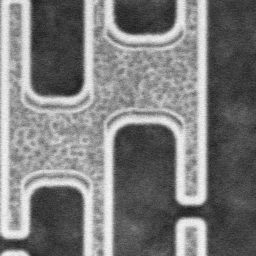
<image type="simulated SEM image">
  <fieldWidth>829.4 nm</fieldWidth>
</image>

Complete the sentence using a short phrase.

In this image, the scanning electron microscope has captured one or a few lines or trenches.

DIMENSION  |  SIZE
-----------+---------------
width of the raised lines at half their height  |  22.4 px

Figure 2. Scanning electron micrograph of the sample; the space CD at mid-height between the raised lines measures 200 nm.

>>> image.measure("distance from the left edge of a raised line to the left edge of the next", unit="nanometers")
283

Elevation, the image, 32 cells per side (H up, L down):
LHHLLLLLLLLHHHLLLLLLLLLHHLLLLLLL
LHHLLLLLLLLHHHLLLLLLLLLHHLLLLLLL
LHHLLLLLLLLHHHLLLLLLLLLHHLLLLLLL
LHHLLLLLLLLHHHLLLLLLLLHHHLLLLLLL
LHHLLLLLLLLHHHHLLLLLLHHHHLLLLLLL
LHHLLLLLLLLHHHHHHHHHHHHHHLLLLLLL
LHHLLLLLLLLHHHHHHHHHHHHHHLLLLLLL
LHHLLLLLLLLHHHHHHHHHHHHHHLLLLLLL
LHHLLLLLLLLHHHHHHHHHHHHHHLLLLLLL
LHHLLLLLLLLHHHHHHHHHHHHHHLLLLLLL
LHHLLLLLLLLHHHHHHHHHHHHHHLLLLLLL
LHHHLLLLLLLHHHHHHHHHHHHHHLLLLLLL
LHHHHLLLLHHHHHHHHHHHHHHHHLLLLLLL
LHHHHHHHHHHHHHHHHHHHHHHHHLLLLLLL
LHHHHHHHHHHHHHHHHHHHHHHHHLLLLLLL
LHHHHHHHHHHHHHHLLLLLLHHHHLLLLLLL
LHHHHHHHHHHHHHLLLLLLLLHHHLLLLLLL
LHHHHHHHHHHHHHLLLLLLLLHHHLLLLLLL
LHHHHHHHHHHHHHLLLLLLLLLHHLLLLLLL
HHHHHHHHHHHHHHLLLLLLLLHHHLLLLLLL
HHHHHHHHHHHHHHLLLLLLLLHHHLLLLLLL
HHHHHHHHHHHHHHLLLLLLLLHHHLLLLLLL
HHHHHHHHHHHHHHLLLLLLLLLHHLLLLLLL
HHHHLLLLLLHHHHLLLLLLLLLHHLLLLLLL
HHHLLLLLLLLHHHLLLLLLLLLHHLLLLLLL
HHHLLLLLLLLHHHLLLLLLLLLLLLLLLLLL
HHHLLLLLLLLHHHLLLLLLLLLLLLLLLLLL
HHHLLLLLLLLHHHLLLLLLLLLLLLLLLLLL
HHHLLLLLLLLHHHLLLLLLLLLHHLLLLLLL
LLLLLLLLLLLHHHLLLLLLLLLHHLLLLLLL
LLLLLLLLLLLHHHLLLLLLLLLHHLLLLLLL
LLLLLLLLLLLHHHLLLLLLLLLHHLLLLLLL